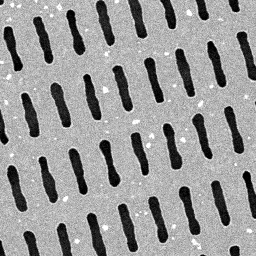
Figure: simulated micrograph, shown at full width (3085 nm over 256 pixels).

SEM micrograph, a regular array of holes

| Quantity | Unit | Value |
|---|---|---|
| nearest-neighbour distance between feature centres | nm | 385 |